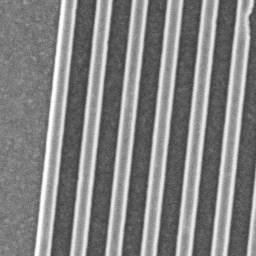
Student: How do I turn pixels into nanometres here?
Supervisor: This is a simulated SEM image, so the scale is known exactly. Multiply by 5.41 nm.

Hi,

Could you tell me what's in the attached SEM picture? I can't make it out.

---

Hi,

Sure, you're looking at parallel lines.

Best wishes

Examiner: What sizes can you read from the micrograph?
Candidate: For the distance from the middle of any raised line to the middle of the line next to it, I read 190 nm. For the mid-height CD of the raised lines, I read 72.7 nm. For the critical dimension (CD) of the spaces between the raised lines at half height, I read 21.9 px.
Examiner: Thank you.